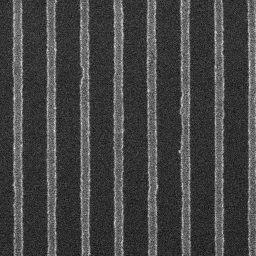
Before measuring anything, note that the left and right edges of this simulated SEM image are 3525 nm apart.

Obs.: parallel lines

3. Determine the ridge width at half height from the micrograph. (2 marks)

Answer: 108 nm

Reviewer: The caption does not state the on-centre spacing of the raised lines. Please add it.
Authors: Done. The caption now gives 461 nm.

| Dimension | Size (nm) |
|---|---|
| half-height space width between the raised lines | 358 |